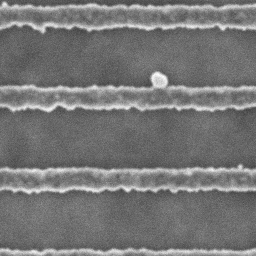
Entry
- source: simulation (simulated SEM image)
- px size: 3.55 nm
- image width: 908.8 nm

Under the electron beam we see lines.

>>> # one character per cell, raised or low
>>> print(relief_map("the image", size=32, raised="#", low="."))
................................
################################
#.###..#########################
....#.....###.....#...........##
................................
................................
................................
................................
................................
...................#............
...................##...........
################################
################################
.##..##.#..###.#.##...#.#####...
................................
................................
................................
................................
................................
................................
................................
################################
################################
################################
................................
................................
................................
................................
................................
................................
................................
#############.#####.############